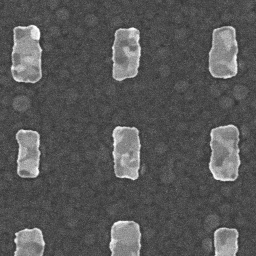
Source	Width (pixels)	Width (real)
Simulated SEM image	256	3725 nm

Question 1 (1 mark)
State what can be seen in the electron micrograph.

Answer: raised bodies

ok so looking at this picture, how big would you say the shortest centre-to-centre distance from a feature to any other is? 1430 nanometers